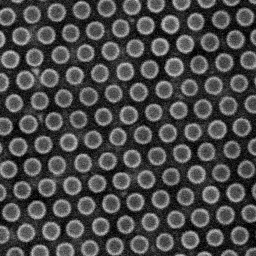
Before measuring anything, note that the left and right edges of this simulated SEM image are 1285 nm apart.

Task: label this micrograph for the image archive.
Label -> a regular array of raised bodies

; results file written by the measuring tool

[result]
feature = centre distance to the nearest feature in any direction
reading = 123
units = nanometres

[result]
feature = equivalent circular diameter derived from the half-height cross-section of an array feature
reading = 16.9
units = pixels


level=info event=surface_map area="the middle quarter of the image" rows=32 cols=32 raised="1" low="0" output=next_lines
00000000110000111000111000111100
01110001111001111001111000111100
01111001111001111000111000111000
01110001111000111000000000000000
01110000000000000000000011000011
00000000000010000111000111100111
00000111000111000111100111100011
11001111001111000111100111100011
11001111000111000111000000000000
11001111000000000000000000000000
10000000000000000000011100011100
00000000011000011100011100011110
00111000111100111100011100011100
00111100111100111100011100001000
00111000111000011100000000000000
00011000000000000000000001100001
00000000000011000011100011110011
00000011100011100011110011110011
11100111100011100011110011110001
11100111100011100001100000000000
11100011100000000000000000001100
10000000000000000000001110001110
00000000001100011110011110011110
00011100011110011110011110001110
00011110011110011110001110000000
00011110011110001100000000000000
00001100000000000000000000110001
00000000000001100001110001111001
00100001110001110001111001111001
11110011110011110001111001110000
11110011110001110001110000000000
11110001110000000000000000000111